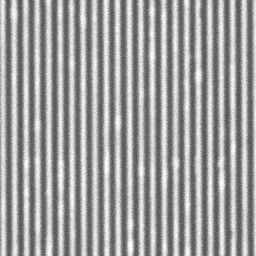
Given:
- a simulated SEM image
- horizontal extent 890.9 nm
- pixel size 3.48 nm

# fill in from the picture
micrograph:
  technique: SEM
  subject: parallel lines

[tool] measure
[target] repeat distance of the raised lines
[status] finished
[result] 0.0401 micrometres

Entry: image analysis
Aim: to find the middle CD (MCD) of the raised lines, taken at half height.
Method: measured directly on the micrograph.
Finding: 13.1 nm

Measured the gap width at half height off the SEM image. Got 26.1 nm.